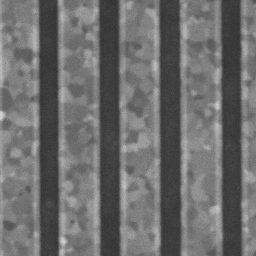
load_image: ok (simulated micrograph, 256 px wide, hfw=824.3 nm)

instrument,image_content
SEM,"one or a few lines or trenches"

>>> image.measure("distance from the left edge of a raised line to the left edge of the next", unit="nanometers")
197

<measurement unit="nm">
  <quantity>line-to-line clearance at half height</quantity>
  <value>77.7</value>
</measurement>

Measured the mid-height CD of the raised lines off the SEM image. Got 0.12 um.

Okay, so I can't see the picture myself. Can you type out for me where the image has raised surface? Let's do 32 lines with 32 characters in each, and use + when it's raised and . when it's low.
++++...+++++...+++++...++++...++
++++....++++...+++++...++++...++
++++....++++...+++++...++++...++
++++....++++...+++++...++++...++
++++....++++...+++++...++++...++
+++++...++++...+++++...++++...++
+++++...++++...+++++...++++...++
+++++...++++...+++++...++++...++
+++++...++++...+++++...++++...++
+++++...++++...+++++...++++...++
+++++...++++...+++++...++++....+
+++++...++++...+++++...++++....+
+++++...++++...+++++...++++....+
+++++...++++...+++++...++++....+
+++++...++++...+++++...++++....+
+++++...++++...+++++...++++....+
+++++...++++...+++++...++++....+
+++++...++++...+++++...++++....+
+++++...++++...+++++...++++....+
+++++...++++...+++++...++++....+
+++++...++++...+++++...++++....+
+++++...++++...+++++...++++....+
+++++...++++...+++++...++++....+
+++++...++++...+++++...++++....+
+++++...++++...+++++...++++....+
+++++...++++...+++++...++++....+
+++++...++++...+++++...++++....+
+++++...++++...+++++...++++....+
+++++...++++...+++++...++++....+
+++++...++++...+++++...++++....+
+++++...++++...+++++...++++....+
+++++...++++...+++++...++++....+